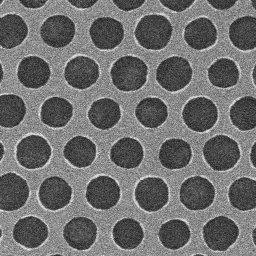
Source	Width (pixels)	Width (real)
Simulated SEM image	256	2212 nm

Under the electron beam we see a regular array of holes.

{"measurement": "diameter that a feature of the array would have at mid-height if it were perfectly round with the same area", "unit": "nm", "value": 297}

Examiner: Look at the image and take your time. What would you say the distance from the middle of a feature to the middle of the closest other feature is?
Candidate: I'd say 45.6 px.